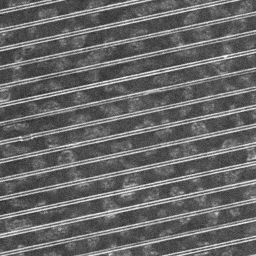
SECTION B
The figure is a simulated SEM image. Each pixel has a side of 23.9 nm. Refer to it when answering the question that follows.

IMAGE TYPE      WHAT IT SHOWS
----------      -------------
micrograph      parallel lines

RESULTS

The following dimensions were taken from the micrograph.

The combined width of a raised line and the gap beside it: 436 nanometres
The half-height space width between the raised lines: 365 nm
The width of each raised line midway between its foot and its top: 75.9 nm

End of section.